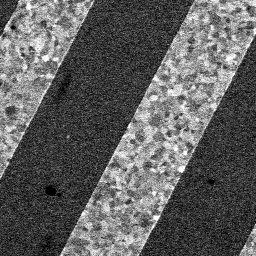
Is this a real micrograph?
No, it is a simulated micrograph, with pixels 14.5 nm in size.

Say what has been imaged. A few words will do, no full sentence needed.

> one or a few lines or trenches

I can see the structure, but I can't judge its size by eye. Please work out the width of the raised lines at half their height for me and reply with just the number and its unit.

69 pixels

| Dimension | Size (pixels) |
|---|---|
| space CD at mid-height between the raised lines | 89.1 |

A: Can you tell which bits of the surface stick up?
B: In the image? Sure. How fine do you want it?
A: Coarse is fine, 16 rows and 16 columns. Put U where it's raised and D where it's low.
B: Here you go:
DUUUUUDDDDDDUUUU
UUUUUDDDDDDUUUUU
UUUUUDDDDDDUUUUU
UUUUDDDDDDUUUUUD
UUUUDDDDDDUUUUUD
UUUDDDDDDUUUUUDD
UUDDDDDDDUUUUUDD
UUDDDDDDUUUUUDDD
UDDDDDDDUUUUUDDD
UDDDDDDUUUUUDDDD
DDDDDDDUUUUUDDDD
DDDDDDUUUUUDDDDD
DDDDDDUUUUDDDDDD
DDDDDUUUUUDDDDDD
DDDDDUUUUDDDDDDD
DDDDUUUUUDDDDDDU